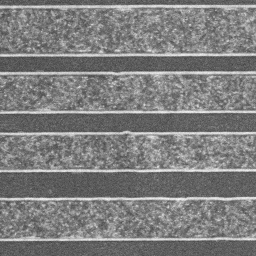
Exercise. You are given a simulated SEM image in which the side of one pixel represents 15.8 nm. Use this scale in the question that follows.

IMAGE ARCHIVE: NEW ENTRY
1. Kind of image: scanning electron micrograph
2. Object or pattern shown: one or a few lines or trenches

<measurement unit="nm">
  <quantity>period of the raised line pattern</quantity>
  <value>991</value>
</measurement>